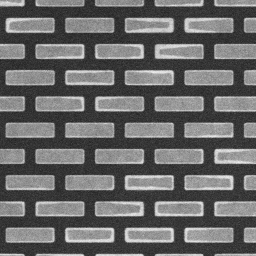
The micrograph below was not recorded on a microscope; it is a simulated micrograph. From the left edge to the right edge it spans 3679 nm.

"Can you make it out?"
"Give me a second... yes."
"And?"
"groups of lines, slits or small figures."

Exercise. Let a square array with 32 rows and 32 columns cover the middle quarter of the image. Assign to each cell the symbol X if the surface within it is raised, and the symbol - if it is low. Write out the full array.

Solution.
--------------------------------
--------------------------------
-XXXXXXXXXXX---XXXXXXXXXXXX---XX
-XXXXXXXXXXX---XXXXXXXXXXXX---XX
-XXXXXXXXXXX---XXXXXXXXXXXX---XX
--------------------------------
--------------------------------
--------------------------------
X------------XXXXXXX---XXXXXXXXX
XXXXX---XXXXXXXXXXXX---XXXXXXXXX
XXXXX---XXXXXXXXXXXX---XXXXXXXXX
XX------------XXXXXX---XXXXXXXXX
--------------------------------
--------------------------------
--------------------------------
-XXXXXXXXXXX---XXXXXXXXXXXX---XX
-XXXXXXXXXXX---XXXXXXXXXXXX---XX
-XXXXXXXXXXX---XXXXXXXXXXXX---XX
--------------------------------
--------------------------------
--------------------------------
--------------------------------
XXXXX---XXXXXXXXXXXX---XXXXXXXXX
XXXXX---XXXXXXXXXXXX---XXXXXXXXX
XXXXX---XXXXXXXXXXXX---XXXXXXXXX
--------------------------------
--------------------------------
--------------------------------
-XXXXXXXXXXX----XXXXXXXXXXX---XX
-XXXXXXXXXXX----XXXXXXXXXXX---XX
-XXXXXXXXXXX----XXXXXXXXXXX---XX
--------------------------------